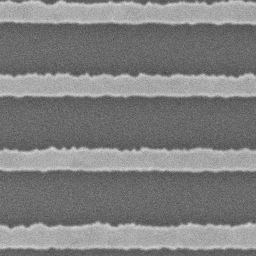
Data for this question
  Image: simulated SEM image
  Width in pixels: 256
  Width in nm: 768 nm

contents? lines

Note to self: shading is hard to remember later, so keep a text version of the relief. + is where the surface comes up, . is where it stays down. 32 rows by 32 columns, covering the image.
++++++.+++..+++++.+..+++++.+++++
++++++++++++++++++++++++++++++++
++++++++++++++++++++++++++++++++
................................
................................
................................
................................
................................
................................
+..++++++.+.++.+.+++..+.++....++
++++++++++++++++++++++++++++++++
++++++++++++++++++++++++++++++++
................................
................................
................................
................................
................................
................................
................................
++++++++++++++++++++++++++++++++
++++++++++++++++++++++++++++++++
................................
................................
................................
................................
................................
................................
................................
+.++++++++++++++++++++++++++++++
++++++++++++++++++++++++++++++++
++++++++++++++++++++++++++++++++
................................